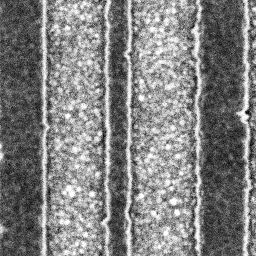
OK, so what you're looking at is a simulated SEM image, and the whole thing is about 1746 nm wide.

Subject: one or a few lines or trenches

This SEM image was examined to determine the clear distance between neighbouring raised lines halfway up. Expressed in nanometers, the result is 449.